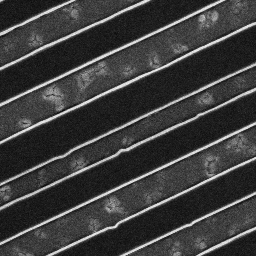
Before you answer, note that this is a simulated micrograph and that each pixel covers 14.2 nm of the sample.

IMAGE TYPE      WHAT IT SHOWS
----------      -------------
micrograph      one or a few lines or trenches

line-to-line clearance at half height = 31.1 pixels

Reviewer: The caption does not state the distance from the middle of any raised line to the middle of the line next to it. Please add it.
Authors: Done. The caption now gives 874 nanometres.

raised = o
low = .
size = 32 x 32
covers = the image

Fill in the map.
oooooooo.........oooooooooo.....
oooooo.........oooooooooo.......
oooo.........oooooooooo.........
oo.........oooooooooo..........o
.........ooooooooo..........oooo
......oooooooooo..........oooooo
....oooooooooo..........oooooooo
..oooooooooo..........oooooooooo
oooooooooo..........ooooooooooo.
oooooooo..........ooooooooooo...
oooooo..........ooooooooooo.....
oooo..........ooooooooooo......o
o..........ooooooooooo.......ooo
.........ooooooooooo.......ooooo
.......ooooooooooo.......ooooooo
.....ooooooooooo.......ooooooooo
...ooooooooooo.......ooooooooo..
.ooooooooooo......oooooooooo....
oooooooooo......oooooooooo......
oooooooo......ooooooooo.........
oooooo......ooooooooo.........oo
ooo.......ooooooooo.........oooo
o.......ooooooooo.........oooooo
.....oooooooooo.........oooooooo
...oooooooooo.........ooooooooo.
.ooooooooo..........ooooooooo...
oooooooo..........ooooooooo.....
oooooo..........ooooooooo.......
oooo..........ooooooooo.........
oo.........ooooooooo..........oo
.........ooooooooo..........oooo
.......ooooooooo..........oooooo